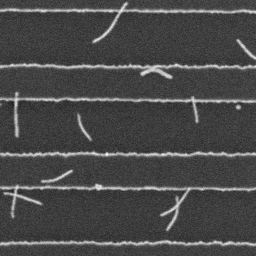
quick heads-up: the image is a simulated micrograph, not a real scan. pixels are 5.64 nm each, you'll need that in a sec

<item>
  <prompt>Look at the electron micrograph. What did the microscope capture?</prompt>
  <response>lines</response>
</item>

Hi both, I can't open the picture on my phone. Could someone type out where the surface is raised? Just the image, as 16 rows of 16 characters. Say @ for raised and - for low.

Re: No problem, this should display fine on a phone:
@@@@@@@@@@@@@@@@
----------------
----------------
----------------
@@@@@@@@@@@@@@@@
@@@@@@@@@@@@@@@@
----------------
----------------
----------------
----------------
@@@@@@@@@@@@@@@@
@@@@@@@@@@@@@@@@
----------------
----------------
----------------
@@@@@@@@@@@@@@@@